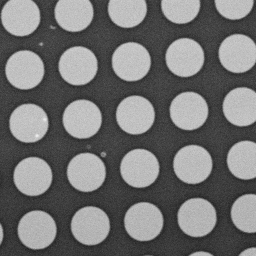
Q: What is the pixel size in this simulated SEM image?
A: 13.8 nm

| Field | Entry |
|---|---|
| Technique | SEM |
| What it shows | an array of small figures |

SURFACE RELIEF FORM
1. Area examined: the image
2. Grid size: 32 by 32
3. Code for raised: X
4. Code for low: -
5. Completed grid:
-XXX---XXXX---XXXX--XXXXX--XXXXX
XXXXX--XXXXX--XXXX--XXXXX--XXXX-
XXXXX--XXXX---XXXX---XXX--------
-XXXX---XXX---------------------
-----------------------------XX-
----------------X----XXXX---XXXX
--XX----XXX---XXXX---XXXX--XXXXX
-XXXX--XXXXX--XXXXX--XXXX---XXXX
-XXXX--XXXXX--XXXXX--XXXX---XXX-
-XXXX---XXXX---XXX----XX--------
-XXXX----XX---------------------
-----------------------------XXX
---------------XXX----XXXX--XXXX
--XXX---XXXX---XXXX--XXXXX--XXXX
-XXXXX--XXXXX--XXXX--XXXXX--XXXX
-XXXXX--XXXXX--XXXX---XXX----XX-
-XXXXX--XXXX----XX--------------
--XXX---------------------------
-----------------------XX----XXX
----------XX----XXX---XXXX--XXXX
--XXXX---XXXX--XXXXX--XXXX--XXXX
--XXXX--XXXXX--XXXXX--XXXX---XXX
--XXXX---XXXX---XXX----XX-------
--XXXX---XXX--------------------
------------------------------XX
-----------------XX----XXX---XXX
----X-----XXX---XXXX--XXXXX--XXX
---XXXX--XXXXX--XXXX--XXXXX--XXX
--XXXXX--XXXXX--XXXX---XXXX---XX
--XXXXX--XXXX---XXXX----X-------
---XXX-----X--------------------
-------------------------X----XX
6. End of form